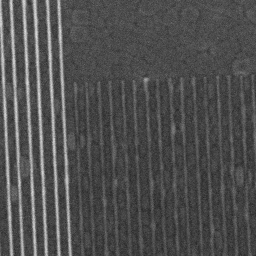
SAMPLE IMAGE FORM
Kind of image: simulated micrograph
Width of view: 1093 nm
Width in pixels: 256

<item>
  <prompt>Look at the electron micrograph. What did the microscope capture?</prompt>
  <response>parallel lines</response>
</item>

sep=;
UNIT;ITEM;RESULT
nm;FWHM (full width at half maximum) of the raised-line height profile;7.5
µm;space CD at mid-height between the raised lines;0.0426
